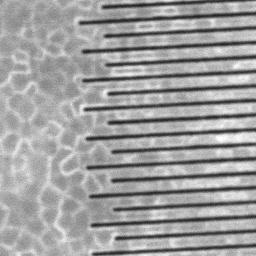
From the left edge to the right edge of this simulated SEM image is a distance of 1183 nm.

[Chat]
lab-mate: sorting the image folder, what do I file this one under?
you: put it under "parallel lines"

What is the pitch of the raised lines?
0.0669 microns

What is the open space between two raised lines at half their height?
16.7 nanometres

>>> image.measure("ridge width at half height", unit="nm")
50.2